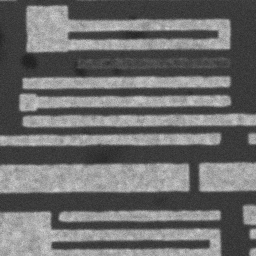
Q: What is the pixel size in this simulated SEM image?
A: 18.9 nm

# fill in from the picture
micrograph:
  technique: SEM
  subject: wiring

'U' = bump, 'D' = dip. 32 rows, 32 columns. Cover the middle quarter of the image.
DDDDUUUUUUUUUUUUUUUUUUUUUUUUUUUU
DDDDDDDDDDDDDDDDDDDDDDDDDDDDDDDD
DDDDDDDDDDDDDDDDDDDDDDDDDDDDDDDD
DDDDDDDDDDDDDDDDDDUUUUUDDDDDUUUU
UUUUUUUUUUUUUUUUUUUUUUUUUUUUUUUU
UUUUUUUUUUUUUUUUUUUUUUUDDUUUUUDD
DDDDDDDDDDDDDDDDDDDDDDDDDDDDDDDD
DDDDDDDDDDDDDDDDDDDDDDDDDDDDDDDD
UUUDDDDUUUUUUUUUUUUUUUUUUUUUUUUU
UUUUUUUUUUUUUUUUUUUUUUUUUUUUUUUU
DDDDDDDDDDDDDDDDDDDDDDDDDDDDDDDD
DDDDDDDDDDDDDDDDDDDDDDDDDDDDDDDD
DDDDDDDDDDDDDDDDDDDDDDDDDDDDDDDD
UUUUUUUUUUUUUUUUUUUUUUUUUUUUUUUU
UUUUUUUUUUUUUUUUUUUUUUUUUUUUUUUU
DDDDDDDDDDDDDDDDDDDDDDDDDDDDDDDD
DDDDDDDDDDDDDDDDDDDDDDDDDDDDDDDD
DDDDDDDDDDDDDDDDDDDDDDDDDDDDDDDD
UUUUUUUUUUUUUUUUUUUUUUUUUUUUUUUU
UUUUUUUUUUUUUUUUUUUUUUUUUUUUUUUU
DDDDDDDDDDDDDDDDDDDDDDDDDDDDDDDD
DDDDDDDDDDDDDDDDDDDDDDDDDDDDDDDD
DDDDDDDDDDDDDDDDDDDDDDDDDDDDDDDD
DDDDDDDDDDDDDDDDDDDDDDDDDDDDDDDD
DDDDDDDDDDDDDDDDDDDDDDDDDDDDDDDD
UUUUUUUUUUUUUUUUUUUUUUUUUUUUUUUD
UUUUUUUUUUUUUUUUUUUUUUUUUUUUUUUD
UUUUUUUUUUUUUUUUUUUUUUUUUUUUUUUD
UUUUUUUUUUUUUUUUUUUUUUUUUUUUUUUD
UUUUUUUUUUUUUUUUUUUUUUUUUUUUUUUD
UUUUUUUUUUUUUUUUUUUUUUUUUUUUUUUD
UUUUUUUUUUUUUUUUUUUUUUUUUUDDDDUD